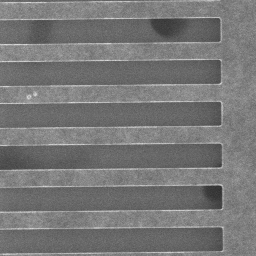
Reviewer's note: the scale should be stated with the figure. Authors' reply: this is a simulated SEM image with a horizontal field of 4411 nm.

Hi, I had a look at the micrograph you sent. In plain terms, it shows groups of lines, slits or small figures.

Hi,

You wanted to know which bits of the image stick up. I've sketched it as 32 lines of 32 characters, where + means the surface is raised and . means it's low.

++++++++++++++++++++++++++++++++
++++++++++++++++++++++++++++++++
...........................+++++
............................++++
............................++++
........++++++++++++++++++++++++
++++++++++++++++++++++++++++++++
++++++++++++++++...........+++++
............................++++
............................++++
...........................+++++
++++++++++++++++++++++++++++++++
++++++++++++++++++++++++++++++++
............................++++
............................++++
...........................+++++
++++++++++++++++++++++++++++++++
++++++++++++++++++++++++++++++++
............................++++
............................++++
............................++++
++++++++++++++++++++++++++++++++
++++++++++++++++++++++++++++++++
............................++++
............................++++
............................++++
++++++++++++++++++++++++++++++++
++++++++++++++++++++++++++++++++
+++++++....................+++++
............................++++
............................++++
...........................+++++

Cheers